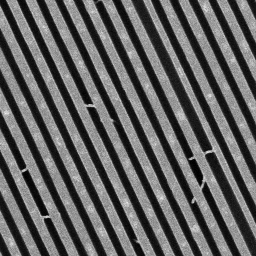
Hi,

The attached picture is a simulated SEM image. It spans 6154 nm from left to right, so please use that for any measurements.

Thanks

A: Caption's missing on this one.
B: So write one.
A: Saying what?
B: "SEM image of parallel lines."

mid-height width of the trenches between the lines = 188 nanometres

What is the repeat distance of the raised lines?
0.417 um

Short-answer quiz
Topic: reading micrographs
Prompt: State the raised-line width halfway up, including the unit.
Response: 234 nm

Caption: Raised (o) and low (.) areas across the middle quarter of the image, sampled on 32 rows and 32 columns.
o..ooo..oo..ooo..ooo..oo....o...
o..ooo..ooo..ooo..oo..ooo...oo..
oo..ooo..oo..ooo..ooo..oo....o..
oo..ooo..ooo..oo..ooo..ooo...oo.
ooo..oo..ooo..ooo..ooo..oo...oo.
ooo..ooo..ooo..oo..ooo..ooo...oo
.ooo..oo..ooo..ooo..ooo..oo...oo
.ooo..ooo..oo...oo..ooo..ooo...o
..ooo..oo..ooo..ooo..oo...oo...o
..ooo..ooo..oo...oo..ooo..ooo...
o..ooooooo..ooo..ooo..oo...oo...
o..ooo..ooo..oo...oo..ooo..ooo..
oo..oo...oo..ooo..ooo..oo...oo..
oo..ooo..ooo..oo...oo..ooo..ooo.
oo...oo..oooo.ooo..ooo..oo..ooo.
ooo..ooo..ooo..oo...oo..ooo..ooo
.oo...oo..ooo..ooo..ooo..oo..ooo
.ooo..ooo..ooo..oo..ooo..ooo..oo
..oo...oo..ooo..ooo..ooo..oo..oo
..ooo..ooo..ooo..oo..ooo..ooo..o
...oo...oo..ooo..ooo..oo..ooo..o
o..ooo..ooo..oo..ooo..ooo..ooo..
o...oo..ooo..ooo..ooo..oo..ooo..
oo..ooo..ooo..oo..ooo..ooo..oo..
oo...oo..ooo..ooo..oo...oo..ooo.
ooo..ooo..oo..ooo..ooo..ooo..oo.
.oo...oo..ooo..ooo..oo...oo..ooo
.ooo..ooo..oo..ooo..ooo..ooo..oo
..oo..ooo..ooo..ooo..oo...oo..oo
..ooo..ooo..oo..ooo..ooo..ooo..o
o..oo..ooo..ooo..ooo..oo..ooo..o
o..ooo..oo...oo..ooo..ooo..ooo..